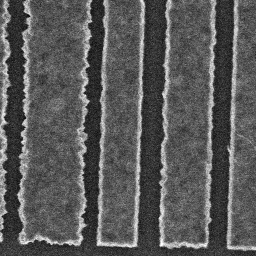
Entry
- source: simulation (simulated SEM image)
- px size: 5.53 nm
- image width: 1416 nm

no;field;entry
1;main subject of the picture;one or a few lines or trenches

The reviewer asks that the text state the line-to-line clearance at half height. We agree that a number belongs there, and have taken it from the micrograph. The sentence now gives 120 nm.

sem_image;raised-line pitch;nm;368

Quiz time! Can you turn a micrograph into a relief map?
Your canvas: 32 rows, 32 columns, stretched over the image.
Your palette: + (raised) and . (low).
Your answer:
+..++++++++..+++++...++++++...++
+..++++++++..+++++...++++++..+++
+...+++++++..+++++...++++++..+++
+...+++++++..+++++...++++++...++
+..++++++++..+++++...++++++..+++
+..++++++++..+++++...++++++..+++
+..++++++++..+++++...++++++..+++
+..++++++++..+++++...++++++..+++
+..++++++++..+++++...++++++..+++
+..+++++++...+++++...++++++..+++
+..++++++++..+++++...+++++...+++
+..+++++++...+++++...+++++...+++
+..++++++++..+++++...+++++...+++
+..++++++++..+++++...+++++...+++
...++++++++..++++....+++++...+++
...+++++++...++++....+++++...+++
...+++++++...++++....+++++...+++
+..+++++++...++++....+++++...+++
+..+++++++...++++...++++++...+++
...+++++++...++++...++++++...+++
...+++++++...++++...++++++...+++
...+++++++...++++...++++++...+++
...+++++++...++++...++++++...+++
...+++++++...++++...++++++...+++
..++++++++...++++...++++++...+++
...++++++++..++++...++++++...+++
...+++++++..+++++...++++++...+++
...+++++++..+++++...++++++...+++
...+++++++..+++++...++++++...+++
...+++++++..+++++...++++++...+++
.......+.....++++....+++++...+++
................................